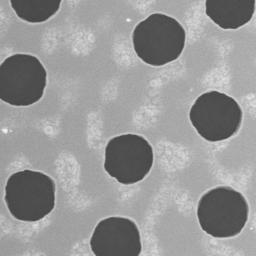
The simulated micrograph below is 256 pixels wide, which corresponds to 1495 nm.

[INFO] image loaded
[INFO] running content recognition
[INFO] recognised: holes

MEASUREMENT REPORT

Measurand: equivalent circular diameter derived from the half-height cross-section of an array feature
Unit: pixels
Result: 50.9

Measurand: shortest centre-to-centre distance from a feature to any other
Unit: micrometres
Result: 0.564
